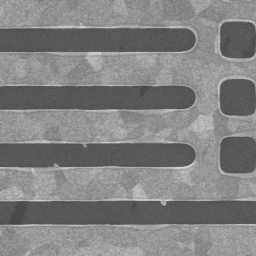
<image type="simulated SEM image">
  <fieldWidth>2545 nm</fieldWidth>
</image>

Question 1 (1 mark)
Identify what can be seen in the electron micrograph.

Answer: groups of lines, slits or small figures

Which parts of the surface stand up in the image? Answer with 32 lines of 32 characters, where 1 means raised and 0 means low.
11111111111111111111111111111111
11111111111111111111111111111111
11111111111111111111111111111011
11000000000000000000000011100000
00000000000000000000000011100000
00000000000000000000000011100000
00000000000000000000000111100000
11111111111111111111111111111001
11111111111111111111111111111111
11111111111111111111111111111111
11111111111111111111111111100000
00000000000000000000000011100000
00000000000000000000000011100000
00000000000000000000000011100000
11111111111111111111111111111000
11111111111111111111111111111111
11111111111111111111111111111111
11111111111111111111111111110000
00000000000000000000000011100000
00000000000000000000000011100000
00000000000000000000000011100000
11111111111111111111111111110000
11111111111111111111111111111111
11111111111111111111111111111111
11111111111111111111111111111111
00000000000000000000000000000000
00000000000000000000000000000000
00000000000000000000000000000000
11111111111111111101111111111111
11111111111111111111111111111111
11111111111111111111111111111111
11111111111111111111111111111111